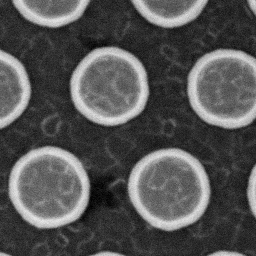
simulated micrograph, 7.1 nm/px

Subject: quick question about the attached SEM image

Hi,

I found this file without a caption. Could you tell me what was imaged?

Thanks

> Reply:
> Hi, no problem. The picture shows raised bodies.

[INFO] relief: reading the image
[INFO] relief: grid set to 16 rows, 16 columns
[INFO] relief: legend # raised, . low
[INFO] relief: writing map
.####....###....
................
................
......##.....##.
#....####...####
##...####...####
#....####...####
#.....##.....##.
................
..##......#.....
.####....###....
.####...#####...
.####...#####...
..###....###....
................
................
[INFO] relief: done